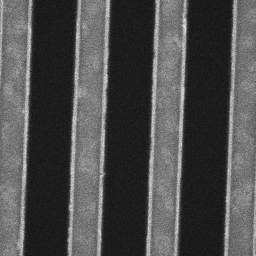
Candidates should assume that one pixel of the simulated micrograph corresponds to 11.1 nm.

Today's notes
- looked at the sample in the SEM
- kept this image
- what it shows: one or a few lines or trenches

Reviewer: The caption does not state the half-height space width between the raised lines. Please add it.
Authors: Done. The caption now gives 305 nanometres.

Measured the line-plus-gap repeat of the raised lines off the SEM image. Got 864 nanometers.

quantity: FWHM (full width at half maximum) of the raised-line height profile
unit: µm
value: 0.559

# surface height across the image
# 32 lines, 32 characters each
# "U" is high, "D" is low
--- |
DDDDUUUUUUDDDUUUUUUUDDDUUUUUUUDD
DDDDUUUUUUDDDUUUUUUUDDDUUUUUUDDD
DDDDUUUUUUDDDUUUUUUUDDDUUUUUUDDD
DDDDUUUUUUDDDUUUUUUUDDDUUUUUUDDD
DDDDUUUUUUDDDUUUUUUUDDDUUUUUUDDD
DDDDUUUUUUDDDUUUUUUUDDDUUUUUUDDD
DDDDUUUUUUDDDUUUUUUUDDDUUUUUUDDD
DDDDUUUUUUDDDUUUUUUUDDDUUUUUUDDD
DDDUUUUUUUDDDUUUUUUUDDDUUUUUUDDD
DDDUUUUUUUDDDUUUUUUDDDDUUUUUUDDD
DDDUUUUUUUDDDUUUUUUDDDDUUUUUUDDD
DDDUUUUUUUDDDUUUUUUDDDDUUUUUUDDD
DDDUUUUUUUDDDUUUUUUDDDDUUUUUUDDD
DDDUUUUUUDDDDUUUUUUDDDDUUUUUUDDD
DDDUUUUUUDDDDUUUUUUDDDDUUUUUUDDD
DDDUUUUUUDDDDUUUUUUDDDDUUUUUUDDD
DDDUUUUUUDDDDUUUUUUDDDDUUUUUUDDD
DDDUUUUUUDDDDUUUUUUDDDUUUUUUUDDD
DDDUUUUUUDDDDUUUUUUDDDUUUUUUUDDD
DDDUUUUUUDDDDUUUUUUDDDUUUUUUUDDD
DDDUUUUUUDDDDUUUUUUDDDUUUUUUUDDD
DDDUUUUUUDDDDUUUUUUDDDUUUUUUUDDD
DDDUUUUUUDDDDUUUUUUDDDUUUUUUUDDD
DDDUUUUUUDDDDUUUUUUDDDUUUUUUUDDD
DDDUUUUUUDDDUUUUUUUDDDUUUUUUUDDD
DDDUUUUUUDDDUUUUUUUDDDUUUUUUUDDD
DDDUUUUUUDDDUUUUUUUDDDUUUUUUUDDD
DDDUUUUUUDDDUUUUUUUDDDUUUUUUUDDD
DDDUUUUUUDDDUUUUUUUDDDUUUUUUDDDD
DDDUUUUUUDDDUUUUUUUDDDUUUUUUDDDD
DDDUUUUUUDDDUUUUUUUDDDUUUUUUDDDD
DDDUUUUUUDDDUUUUUUUDDDUUUUUUDDDD